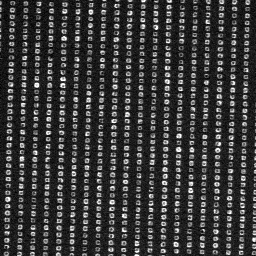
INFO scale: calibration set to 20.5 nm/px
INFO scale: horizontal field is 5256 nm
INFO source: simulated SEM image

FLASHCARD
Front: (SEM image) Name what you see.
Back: a regular array of raised bodies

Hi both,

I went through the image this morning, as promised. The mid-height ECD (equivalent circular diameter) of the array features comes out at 83.5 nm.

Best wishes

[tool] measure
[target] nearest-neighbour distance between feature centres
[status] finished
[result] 0.134 um